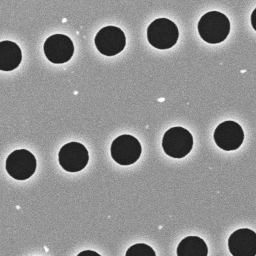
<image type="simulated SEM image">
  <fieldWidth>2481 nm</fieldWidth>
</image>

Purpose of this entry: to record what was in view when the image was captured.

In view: a regular array of holes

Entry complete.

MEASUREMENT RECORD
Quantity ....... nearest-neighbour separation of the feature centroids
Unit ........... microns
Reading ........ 0.505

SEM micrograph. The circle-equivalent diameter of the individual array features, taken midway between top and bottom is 305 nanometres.